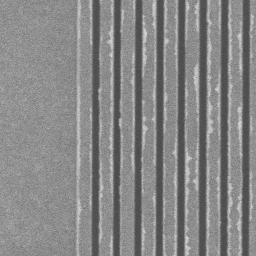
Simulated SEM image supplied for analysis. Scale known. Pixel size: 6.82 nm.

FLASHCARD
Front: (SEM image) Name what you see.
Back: parallel lines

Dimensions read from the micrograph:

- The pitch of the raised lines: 0.146 µm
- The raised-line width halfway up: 101 nanometres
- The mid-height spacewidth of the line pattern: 44.3 nm